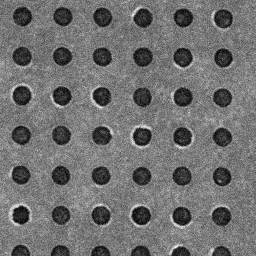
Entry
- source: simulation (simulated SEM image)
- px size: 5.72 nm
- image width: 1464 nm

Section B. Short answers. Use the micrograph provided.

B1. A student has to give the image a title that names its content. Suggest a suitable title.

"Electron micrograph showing a regular array of holes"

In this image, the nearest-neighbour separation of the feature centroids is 226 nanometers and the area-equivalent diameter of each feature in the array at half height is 112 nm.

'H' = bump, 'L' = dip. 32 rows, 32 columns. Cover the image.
HHHHHHHHHHHHHHHHHHHHHHHHHHHHHHHH
HHLLHHHLLHHHLLHHHLLHHHLLHHHLLHHH
HHLLHHHLLHHHLLHHHLLHHHLLHHHLLHHH
HHHHHHHHHHHHHHHHHHHHHHHHHHHHHHHH
HHHHHHHHHHHHHHHHHHHHHHHHHHHHHHHH
HHHHHHHHHHHHHHHHHHHHHHHHHHHHHHHH
HHLLHHHLLHHHLLHHHLLHHHLLHHHLLHHH
HHLLHHHLLHHHLLHHHLLHHHLLHHHLLHHH
HHHHHHHHHHHHHHHHHHHHHHHHHHHHHHHH
HHHHHHHHHHHHHHHHHHHHHHHHHHHHHHHH
HHHHHHHHHHHHHHHHHHHHHHHHHHHHHHHH
HHLLHHHLLHHHLLHHHLLHHHLLHHHLLHHH
HHLLHHHLLHHHLLHHHLLHHHLLHHHLLHHH
HHHHHHHHHHHHHHHHHHHHHHHHHHHHHHHH
HHHHHHHHHHHHHHHHHHHHHHHHHHHHHHHH
HHHHHHHHHHHHHHHHHHHHHHHHHHHHHHHH
HLLLHHLLLHHHLLHHHLLHHHLLHHHLLHHH
HHLLHHHLLHHHLLHHHLLHHHLLHHHLLHHH
HHHHHHHHHHHHHHHHHHHHHHHHHHHHHHHH
HHHHHHHHHHHHHHHHHHHHHHHHHHHHHHHH
HHHHHHHHHHHHHHHHHHHHHHHHHHHHHHHH
HHLLHHHLLHHHLLHHHLLHHHLLHHHLLHHH
HHLLHHHLLHHHLLHHHLLHHHLLHHHLLHHH
HHHHHHHHHHHHHHHHHHHHHHHHHHHHHHHH
HHHHHHHHHHHHHHHHHHHHHHHHHHHHHHHH
HHHHHHHHHHHHHHHHHHHHHHHHHHHHHHHH
HHLLHHHLLHHHLLHHHLLHHHLLHHHLLHHH
HHLHHHHLLHHHLLHHHLLHHHLLHHHLLHHH
HHHHHHHHHHHHHHHHHHHHHHHHHHHHHHHH
HHHHHHHHHHHHHHHHHHHHHHHHHHHHHHHH
HHHHHHHHHHHHHHHHHHHHHHHHHHHHHHHH
HLLLHHLLLHHLLLHHLLLHHHLLHHHLLHHH